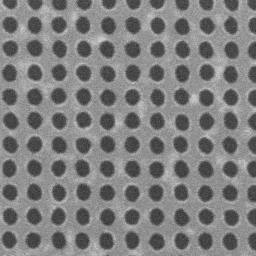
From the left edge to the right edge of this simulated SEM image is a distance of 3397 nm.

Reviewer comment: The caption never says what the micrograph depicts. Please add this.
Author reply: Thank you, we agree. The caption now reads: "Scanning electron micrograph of a regular array of holes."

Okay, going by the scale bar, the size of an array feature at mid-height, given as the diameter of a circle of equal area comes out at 234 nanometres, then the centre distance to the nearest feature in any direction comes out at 314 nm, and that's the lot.